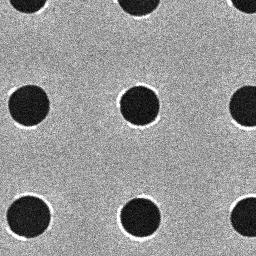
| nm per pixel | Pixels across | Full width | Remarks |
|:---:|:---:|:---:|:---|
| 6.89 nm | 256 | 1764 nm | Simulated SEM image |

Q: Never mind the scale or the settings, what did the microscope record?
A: holes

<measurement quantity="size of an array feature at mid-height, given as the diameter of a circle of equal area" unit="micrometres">0.283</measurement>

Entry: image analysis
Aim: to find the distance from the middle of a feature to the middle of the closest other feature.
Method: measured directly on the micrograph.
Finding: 0.766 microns